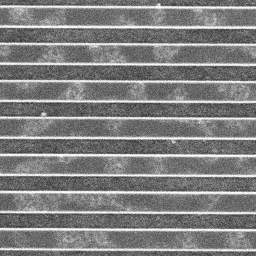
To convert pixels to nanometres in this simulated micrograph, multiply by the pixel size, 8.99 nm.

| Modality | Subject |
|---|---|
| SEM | parallel lines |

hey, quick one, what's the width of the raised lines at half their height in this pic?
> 20.5 pixels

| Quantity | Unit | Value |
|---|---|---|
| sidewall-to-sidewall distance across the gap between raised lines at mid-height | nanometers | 147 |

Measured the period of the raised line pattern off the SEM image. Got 0.334 microns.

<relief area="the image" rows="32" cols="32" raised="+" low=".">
................................
++++++++++++++++++++++++++++++++
++++++++++++++++++++++++++++++++
................................
................................
..............+.................
++++++++++++++++++++++++++++++++
++++++++++++++++++++++++++++++++
................................
................................
++++++++++++++++++++++++++++++++
++++++++++++++++++++++++++++++++
++++++++++++++++++++++++++++++++
................................
................................
++++++++++++++++++++++++++++++++
++++++++++++++++++++++++++++++++
................................
................................
++++++++++++++++++++++++........
++++++++++++++++++++++++++++++++
++++++++++++++++++++++++++++++++
................................
................................
++++++++++++++++++++++++++++++++
++++++++++++++++++++++++++++++++
..++++++++++++++++++++++++++++++
................................
................................
++++++++++++++++++++++++++++++++
++++++++++++++++++++++++++++++++
................................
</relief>